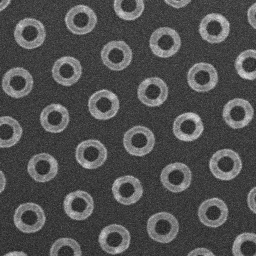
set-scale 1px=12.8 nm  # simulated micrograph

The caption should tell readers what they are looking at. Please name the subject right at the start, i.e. a regular array of ring-shaped raised bodies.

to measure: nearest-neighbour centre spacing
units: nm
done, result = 639